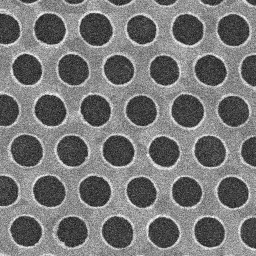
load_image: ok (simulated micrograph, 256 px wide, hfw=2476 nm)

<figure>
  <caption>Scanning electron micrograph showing a regular array of holes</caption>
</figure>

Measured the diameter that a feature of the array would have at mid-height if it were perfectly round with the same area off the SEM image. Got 316 nm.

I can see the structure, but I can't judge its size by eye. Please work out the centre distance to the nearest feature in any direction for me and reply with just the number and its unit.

441 nm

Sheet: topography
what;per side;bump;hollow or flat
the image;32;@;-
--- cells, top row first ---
@@@@@@@@@-@@@@--@@@@--@@@@-@@@@-
@@@@@@@@@@@@@@@@@@@@@@@@@@@@@@@@
--@@@---@@----@@---@@@---@@----@
--@@----@@----@@----@-----@----@
--@@----@@----@@----@@---@@----@
-@@@@@-@@@@--@@@@--@@@@--@@@--@@
@@@@@@@@@@@@@@@@@@@@@@@@@@@@@@@@
@@---@@----@@---@@@---@@@---@@--
@----@@----@@----@@---@@----@@--
@@---@@----@@----@@---@@@---@@--
@@@--@@@--@@@@--@@@@--@@@---@@@-
@@@@@@@@@@@@@@@@@@@@@@@@@@@@@@@@
--@@@---@@---@@@---@@@---@@@---@
--@@----@@----@@----@----@@----@
--@@----@@----@@----@----@@----@
--@@@---@@@--@@@@--@@@---@@@--@@
@@@@@@@@@@@@@@@@@@@@@@@@@@@@@@@@
@@---@@---@@@---@@@---@@@---@@@-
@----@@----@@----@@---@@----@@--
@----@@----@@----@@---@@----@@--
@@---@@@--@@@@--@@@---@@@---@@@-
@@@@@@@@@@@@@@@@@@@@@@@@@@@@@@@@
--@@@---@@---@@@---@@@--@@@@--@@
--@@----@@----@@----@----@@----@
--@@----@@----@@----@----@@----@
--@@@---@@@--@@@@--@@@---@@@---@
@@@@@@@@@@@@@@@@@@@@@@@@@@@@@@@@
@@---@@@--@@@---@@@---@@@--@@@@-
@----@@----@@----@@---@@----@@--
@----@@----@@----@@----@----@@--
@@--@@@@--@@@---@@@---@@@---@@@-
@@@@@@@@@@@@@@@@@@@@@@@@@@@@@@@@